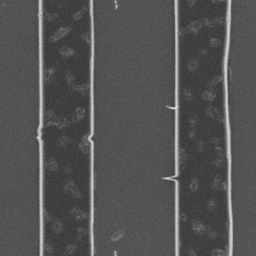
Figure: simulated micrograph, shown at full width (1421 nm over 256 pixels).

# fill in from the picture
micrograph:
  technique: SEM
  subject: one or a few lines or trenches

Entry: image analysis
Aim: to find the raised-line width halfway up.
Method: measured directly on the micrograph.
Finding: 288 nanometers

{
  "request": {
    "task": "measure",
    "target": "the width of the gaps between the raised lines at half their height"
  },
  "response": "83.3 pixels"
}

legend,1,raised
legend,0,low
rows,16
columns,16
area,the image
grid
0011110000011100
0011110000011100
0001110000011100
0001110000011100
0001110000011100
0001110000011100
0001110000011100
0001110000011100
0011110000011100
0001110000011100
0001110000011100
0001110000011100
0001110000011100
0001110000011100
0001110000011100
0001110000011100